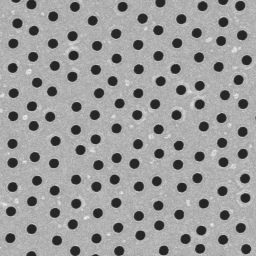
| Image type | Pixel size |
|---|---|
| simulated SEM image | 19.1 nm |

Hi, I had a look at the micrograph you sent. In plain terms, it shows a regular array of holes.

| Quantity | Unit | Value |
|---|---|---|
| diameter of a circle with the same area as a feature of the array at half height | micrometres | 0.192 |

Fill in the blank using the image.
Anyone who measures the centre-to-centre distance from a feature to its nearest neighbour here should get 390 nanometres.